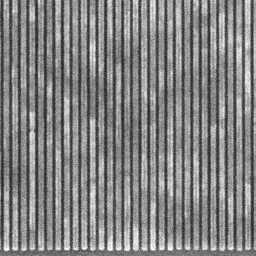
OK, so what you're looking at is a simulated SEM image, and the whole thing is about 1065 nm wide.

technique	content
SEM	parallel lines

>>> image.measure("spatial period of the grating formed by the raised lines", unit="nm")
35.9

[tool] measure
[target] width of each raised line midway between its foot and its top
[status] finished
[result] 18.7 nm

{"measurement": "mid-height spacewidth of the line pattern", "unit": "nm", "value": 15.1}